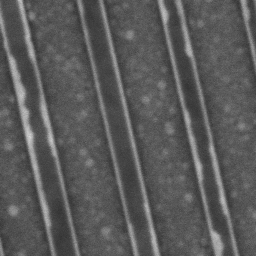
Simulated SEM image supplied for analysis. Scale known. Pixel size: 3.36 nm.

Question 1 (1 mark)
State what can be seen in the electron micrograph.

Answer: one or a few lines or trenches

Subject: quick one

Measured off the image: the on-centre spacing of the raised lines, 263 nm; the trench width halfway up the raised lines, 185 nanometers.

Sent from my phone